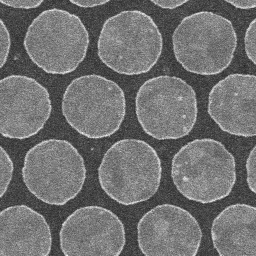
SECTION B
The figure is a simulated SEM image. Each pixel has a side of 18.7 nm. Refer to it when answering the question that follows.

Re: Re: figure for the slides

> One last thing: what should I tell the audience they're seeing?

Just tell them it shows a regular array of raised bodies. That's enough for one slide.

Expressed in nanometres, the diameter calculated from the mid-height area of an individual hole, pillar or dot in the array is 1180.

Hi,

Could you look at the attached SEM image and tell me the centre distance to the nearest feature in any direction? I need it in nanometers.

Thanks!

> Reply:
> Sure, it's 1370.